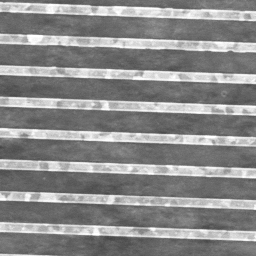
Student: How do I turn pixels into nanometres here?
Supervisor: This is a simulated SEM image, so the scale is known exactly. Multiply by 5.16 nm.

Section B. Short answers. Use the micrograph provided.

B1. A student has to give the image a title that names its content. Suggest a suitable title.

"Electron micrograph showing parallel lines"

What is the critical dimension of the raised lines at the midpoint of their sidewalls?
43.8 nm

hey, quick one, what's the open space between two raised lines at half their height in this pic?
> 120 nm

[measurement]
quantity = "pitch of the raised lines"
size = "162 nanometers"